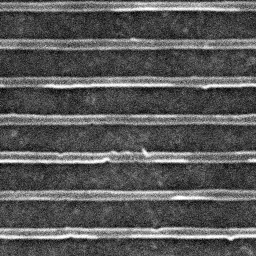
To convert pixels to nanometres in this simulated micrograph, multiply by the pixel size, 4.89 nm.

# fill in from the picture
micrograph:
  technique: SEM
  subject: parallel lines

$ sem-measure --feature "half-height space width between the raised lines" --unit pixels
28.8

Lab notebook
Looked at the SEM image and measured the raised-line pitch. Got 0.185 µm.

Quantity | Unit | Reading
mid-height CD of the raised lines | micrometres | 0.0422